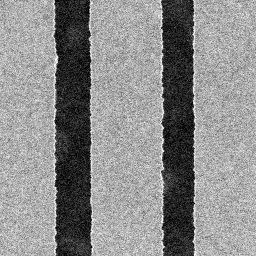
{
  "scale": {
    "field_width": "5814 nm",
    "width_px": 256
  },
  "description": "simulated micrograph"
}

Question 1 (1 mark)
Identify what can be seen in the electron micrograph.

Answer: one or a few lines or trenches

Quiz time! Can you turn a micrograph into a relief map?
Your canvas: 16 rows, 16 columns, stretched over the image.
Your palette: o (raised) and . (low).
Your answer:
ooo...oooo..oooo
ooo...oooo..oooo
ooo...oooo..oooo
oooo..oooo..oooo
ooo...oooo..oooo
ooo...oooo..oooo
ooo...oooo..oooo
ooo...oooo..oooo
ooo...oooo..oooo
ooo...oooo..oooo
ooo...oooo..oooo
ooo...oooo..oooo
ooo...oooo..oooo
ooo...oooo..oooo
ooo...oooo..oooo
ooo...oooo..oooo